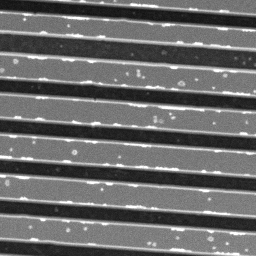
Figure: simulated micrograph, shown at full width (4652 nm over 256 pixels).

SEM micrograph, parallel lines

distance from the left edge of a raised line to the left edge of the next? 745 nm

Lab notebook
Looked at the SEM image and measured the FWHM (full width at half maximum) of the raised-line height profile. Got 0.451 micrometres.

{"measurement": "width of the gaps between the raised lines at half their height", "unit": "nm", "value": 283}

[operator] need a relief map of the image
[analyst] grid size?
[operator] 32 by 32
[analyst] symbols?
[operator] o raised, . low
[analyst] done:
.............ooooooooooooooooooo
.o........................oooooo
oooooooooooooooo................
ooooooooooooooooooooooooooooo...
.......ooooooooooooooooooooooooo
......................oooooooooo
................................
ooooooooooo.....................
ooooooooooooooooooooooooo.......
oooooooooooooooooooooooooooooooo
............oooooooooooooooooooo
........................oooooooo
ooooooooooo.....................
oooooooooooooooooooooooooo......
oooooooooooooooooooooooooooooooo
.........ooooooooooooooooooooooo
.........................ooooooo
ooooooooooo.....................
oooooooooooooooooooooooo........
oooooooooooooooooooooooooooooooo
..........oooooooooooooooooooooo
........................oooooooo
oooooooooo......................
ooooooooooooooooooooooo.........
oooooooooooooooooooooooooooooooo
.........ooooooooooooooooooooooo
.......................ooooooooo
ooooooooo.......................
oooooooooooooooooooooooo........
oooooooooooooooooooooooooooooooo
........oooooooooooooooooooooooo
......................oooooooooo